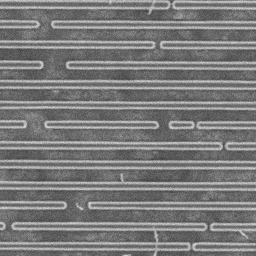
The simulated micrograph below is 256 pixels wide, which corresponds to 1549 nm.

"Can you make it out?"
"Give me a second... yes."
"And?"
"parallel lines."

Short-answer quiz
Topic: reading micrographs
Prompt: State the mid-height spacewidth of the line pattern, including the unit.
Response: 83.9 nm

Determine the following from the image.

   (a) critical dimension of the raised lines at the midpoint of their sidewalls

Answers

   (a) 0.037 microns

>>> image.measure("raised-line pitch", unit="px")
20.1